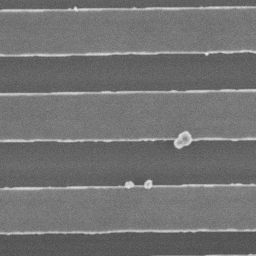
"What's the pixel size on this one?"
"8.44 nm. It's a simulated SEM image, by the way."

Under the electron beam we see lines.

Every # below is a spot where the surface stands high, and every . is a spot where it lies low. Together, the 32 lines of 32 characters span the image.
................................
################################
################################
################################
################################
################################
#############################...
................................
................................
................................
................................
.............###################
################################
################################
################################
################################
################################
####################.####....#..
................................
................................
................................
................................
................................
#.##############################
################################
################################
################################
################################
################################
................................
................................
................................